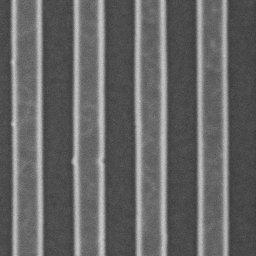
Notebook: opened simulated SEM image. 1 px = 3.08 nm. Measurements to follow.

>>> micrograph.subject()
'parallel lines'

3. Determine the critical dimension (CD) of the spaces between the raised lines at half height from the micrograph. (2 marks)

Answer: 105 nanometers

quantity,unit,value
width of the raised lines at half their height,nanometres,84.6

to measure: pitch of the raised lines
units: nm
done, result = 190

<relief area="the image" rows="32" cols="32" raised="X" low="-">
--XXX----XXXX----XXX-----XXX----
--XXX----XXXX----XXX-----XXX----
--XXX----XXXX----XXX-----XXX----
--XXX----XXXX----XXX-----XXX----
--XXX-----XXX----XXX-----XXX----
--XXX-----XXX----XXX-----XXX----
--XXX-----XXX----XXX-----XXX----
--XXX----XXXX----XXX-----XXX----
--XXX----XXXX----XXXX----XXX----
--XXX----XXXX----XXXX----XXX----
--XXX----XXXX----XXXX----XXX----
--XXX----XXXX----XXXX----XXX----
--XXX----XXXX----XXXX----XXX----
--XXX----XXXX----XXX-----XXX----
--XXX----XXXX----XXX-----XXX----
--XXX----XXXX----XXXX----XXX----
--XXX----XXXX----XXXX----XXX----
--XXX----XXXX----XXXX----XXX----
--XXX----XXXX----XXXX----XXX----
--XXX----XXXX----XXXX----XXX----
--XXX----XXXX----XXXX----XXX----
--XXX----XXXX----XXXX----XXX----
--XXX-----XXX----XXXX----XXX----
--XXX-----XXX----XXXX----XXX----
--XXX-----XXX----XXXX----XXX----
--XXX-----XXX----XXXX----XXX----
--XXX-----XXX----XXXX----XXX----
--XXX-----XXX----XXXX----XXX----
--XXX-----XXX----XXXX----XXX----
--XXX-----XXX----XXXX----XXX----
--XXX-----XXX----XXXX----XXX----
--XXX-----XXX----XXXX----XXX----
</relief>